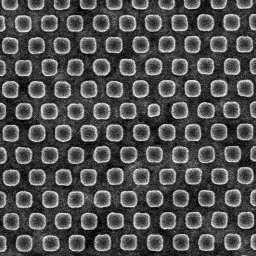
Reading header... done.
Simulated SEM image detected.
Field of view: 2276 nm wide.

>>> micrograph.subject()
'a regular array of raised bodies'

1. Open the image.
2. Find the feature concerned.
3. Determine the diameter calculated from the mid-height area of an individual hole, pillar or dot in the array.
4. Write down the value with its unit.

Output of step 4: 150 nanometres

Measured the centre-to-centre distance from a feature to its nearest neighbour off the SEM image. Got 25.2 px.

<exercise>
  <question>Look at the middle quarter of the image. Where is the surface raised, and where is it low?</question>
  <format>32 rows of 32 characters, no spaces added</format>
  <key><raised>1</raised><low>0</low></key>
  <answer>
01111001111000111100111100011110
01111000111000111100111100011110
01110000111000011000011100001100
00000000000000000000000000000000
10000110000111000011000011100001
10001111000111100111100011110011
10001111000111100111100011110011
10001111000111100011100011100001
00000000000000000000000000000000
00000000000000000000000000000000
01111000111000111100011100011110
01111000111000111100011100011110
01111000111000111100011100011110
00110000111000011000000000000000
00000000000000000000000000000000
10000110000111000011100011100001
11001111000111100011100011110011
11001111000111100111100011110011
11000111000111100011100011100001
00000000000000000000000000000000
00000000000000000000000000000000
01111000111000111100011100011110
01111000111000111100011110011110
01111000111000111100011100011110
01110000110000000000000000001100
00000000000000000000000000000000
00000111000111000011100011100001
11001111000111100111100011110001
11001111000111100111100011110001
11001111000111000011100011110001
00000000000000000000000000000000
00000000000000000000000000000000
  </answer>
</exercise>